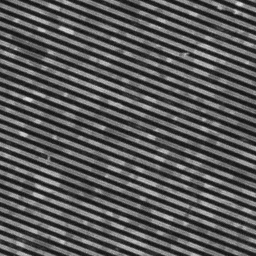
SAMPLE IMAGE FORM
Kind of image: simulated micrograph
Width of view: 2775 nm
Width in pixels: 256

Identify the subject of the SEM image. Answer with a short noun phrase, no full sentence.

parallel lines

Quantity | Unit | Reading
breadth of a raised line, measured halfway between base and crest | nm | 27.8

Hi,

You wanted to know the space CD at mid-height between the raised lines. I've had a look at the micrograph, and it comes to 64.5 nanometres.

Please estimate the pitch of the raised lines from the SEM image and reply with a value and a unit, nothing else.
93.8 nanometers